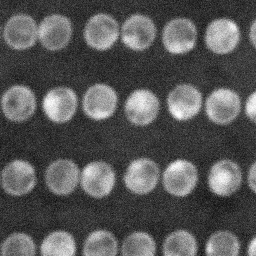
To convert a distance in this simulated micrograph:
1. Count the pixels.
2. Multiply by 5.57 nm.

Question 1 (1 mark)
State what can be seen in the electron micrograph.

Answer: a regular array of raised bodies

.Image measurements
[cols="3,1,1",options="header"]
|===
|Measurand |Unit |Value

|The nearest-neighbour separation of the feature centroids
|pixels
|38.9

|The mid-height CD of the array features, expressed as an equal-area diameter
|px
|32.4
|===